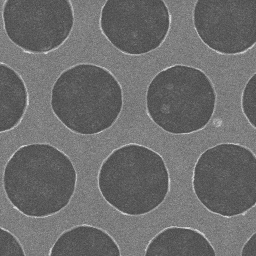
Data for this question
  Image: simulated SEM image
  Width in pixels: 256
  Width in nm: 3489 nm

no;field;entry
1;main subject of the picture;holes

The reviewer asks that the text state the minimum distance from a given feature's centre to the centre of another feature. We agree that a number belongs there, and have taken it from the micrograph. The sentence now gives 1270 nm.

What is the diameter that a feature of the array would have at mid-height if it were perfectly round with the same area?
0.945 micrometres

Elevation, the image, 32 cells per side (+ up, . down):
+........++++........++++.......
.........++++........+++........
+........++++........+++........
+........++++........+++........
+.......+++++........++++.......
++......++++++......++++++......
+++++++++++++++...++++++++++..++
++++++++++++++++++++++++++++++++
.++++++++....++++++++...++++++++
..++++++......++++++......++++++
...++++........++++.......+++++.
...++++........+++.........+++..
...+++.........+++.........+++..
...++++........+++.........+++..
...++++........++++.......+++++.
..++++++......++++++......++++++
+++++++++...+++++++++...++++++++
++++++++++++++++++++++++++++++++
+++....++++++++...++++++++.....+
++......++++++......+++++.......
+........++++.......+++++.......
+........++++........+++........
.........+++.........+++........
+........+++.........+++........
+........++++........++++.......
++......++++++......+++++.......
+++....++++++++...+++++++++...++
++++++++++++++++++++++++++++++++
+++++++++...++++++++++++++++++++
..++++++......++++++.....+++++++
..+++++.......+++++.......+++++.
...+++.........+++.........+++..